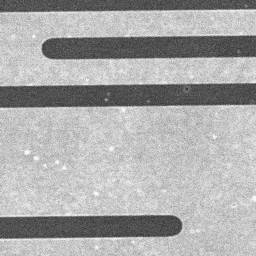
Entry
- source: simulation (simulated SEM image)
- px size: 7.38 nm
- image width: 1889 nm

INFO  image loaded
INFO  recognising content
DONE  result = groups of lines, slits or small figures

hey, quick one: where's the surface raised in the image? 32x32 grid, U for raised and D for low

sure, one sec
DDDDDDDDDDDDDDDDDDDDDDDDDDDDDDDD
DDDDDDDDDDDDDDDUUUUUUUUUUUUUUUUU
UUUUUUUUUUUUUUUUUUUUUUUUUUUUUUUU
UUUUUUUUUUUUUUUUUUUUUUUUUUUUUUUU
UUUUUUUUUUUUUUUUUUUUDDDDDDDDDDDD
UUUUUDDDDDDDDDDDDDDDDDDDDDDDDDDD
UUUUUDDDDDDDDDDDDDDDDDDDDDDDDDDD
UUUUUUUDDDUUUUUUUUUUUUUUUUUUUUUU
UUUUUUUUUUUUUUUUUUUUUUUUUUUUUUUU
UUUUUUUUUUUUUUUUUUUUUUUUUUUUUUUU
UUUUUUUUUUUUUUUDDDDDDDDDDDDDDDDD
DDDDDDDDDDDDDDDDDDDDDDDDDDDDDDDD
DDDDDDDDDDDDDDDDDDDDDDDDDDDDDDDD
DDDDDDDDDDDUUUUUUUUUUUUUUUUUUUUU
UUUUUUUUUUUUUUUUUUUUUUUUUUUUUUUU
UUUUUUUUUUUUUUUUUUUUUUUUUUUUUUUU
UUUUUUUUUUUUUUUUUUUUUUUUUUUUUUUU
UUUUUUUUUUUUUUUUUUUUUUUUUUUUUUUU
UUUUUUUUUUUUUUUUUUUUUUUUUUUUUUUU
UUUUUUUUUUUUUUUUUUUUUUUUUUUUUUUU
UUUUUUUUUUUUUUUUUUUUUUUUUUUUUUUU
UUUUUUUUUUUUUUUUUUUUUUUUUUUUUUUU
UUUUUUUUUUUUUUUUUUUUUUUUUUUUUUUU
UUUUUUUUUUUUUUUUUUUUUUUUUUUUUUUU
UUUUUUUUUUUUUUUUUUUUUUUUUUUUUUUU
UUUUUUUUUUUUUUUUUUUUUUUUUUUUUUUU
UUUUUUUUUUUUUUUUUUUUUUUUUUUUUUUU
DDDDDDDDDDDDDDDDDDDDDDDUUUUUUUUU
DDDDDDDDDDDDDDDDDDDDDDDUUUUUUUUU
DDDDDDDDDDDDDDDDDDDDDDUUUUUUUUUU
UUUUUUUUUUUUUUUUUUUUUUUUUUUUUUUU
UUUUUUUUUUUUUUUUUUUUUUUUUUUUUUUU